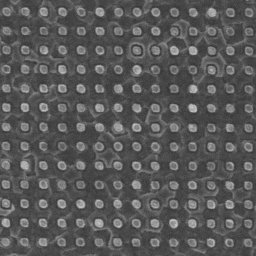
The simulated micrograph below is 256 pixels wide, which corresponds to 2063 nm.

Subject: a regular array of raised bodies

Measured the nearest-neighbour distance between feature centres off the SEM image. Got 149 nm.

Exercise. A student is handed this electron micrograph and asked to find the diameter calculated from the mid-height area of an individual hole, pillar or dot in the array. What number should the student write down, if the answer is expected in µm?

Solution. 0.0643